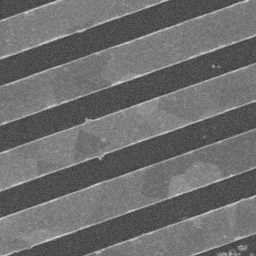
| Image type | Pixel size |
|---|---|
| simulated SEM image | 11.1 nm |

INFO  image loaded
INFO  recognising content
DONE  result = one or a few lines or trenches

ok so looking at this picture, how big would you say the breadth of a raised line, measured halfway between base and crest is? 403 nm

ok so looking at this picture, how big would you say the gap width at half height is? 291 nm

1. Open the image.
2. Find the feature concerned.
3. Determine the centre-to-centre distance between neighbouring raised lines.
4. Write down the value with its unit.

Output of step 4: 693 nanometers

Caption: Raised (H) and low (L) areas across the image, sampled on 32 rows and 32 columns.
LLLLLLHHHHHHHHHHHHHHLLLLLLLLLHHH
LLLHHHHHHHHHHHHHHLLLLLLLLLLHHHHH
HHHHHHHHHHHHHHLLLLLLLLLLHHHHHHHH
HHHHHHHHHHHLLLLLLLLLLHHHHHHHHHHH
HHHHHHHHLLLLLLLLLLHHHHHHHHHHHHHH
HHHHHLLLLLLLLLLHHHHHHHHHHHHHHLLL
HHHLLLLLLLLLHHHHHHHHHHHHHHLLLLLL
LLLLLLLLLLHHHHHHHHHHHHHLLLLLLLLL
LLLLLLLHHHHHHHHHHHHHLLLLLLLLLLHH
LLLLHHHHHHHHHHHHHHLLLLLLLLLHHHHH
LHHHHHHHHHHHHHHLLLLLLLLLLHHHHHHH
HHHHHHHHHHHHLLLLLLLLLLHHHHHHHHHH
HHHHHHHHHLLLLLLLLLLHHHHHHHHHHHHH
HHHHHHLLLLLLLLLLHHHHHHHHHHHHHLLL
HHHLLLLLLLLLLHHHHHHHHHHHHHHLLLLL
LLLLLLLLLLHHHHHHHHHHHHHHLLLLLLLL
LLLLLLLLHHHHHHHHHHHHHLLLLLLLLLLH
LLLLLHHHHHHHHHHHHHLLLLLLLLLLHHHH
LLHHHHHHHHHHHHHLLLLLLLLLLHHHHHHH
HHHHHHHHHHHHHLLLLLLLLLHHHHHHHHHH
HHHHHHHHHHLLLLLLLLLHHHHHHHHHHHHH
HHHHHHHLLLLLLLLLLHHHHHHHHHHHHHLL
HHHHLLLLLLLLLLHHHHHHHHHHHHHHLLLL
HLLLLLLLLLLHHHHHHHHHHHHHHLLLLLLL
LLLLLLLLHHHHHHHHHHHHHHLLLLLLLLLL
LLLLLHHHHHHHHHHHHHHLLLLLLLLLLHHH
LLHHHHHHHHHHHHHHLLLLLLLLLLHHHHHH
HHHHHHHHHHHHHLLLLLLLLLLHHHHHHHHH
HHHHHHHHHHHLLLLLLLLLHHHHHHHHHHHH
HHHHHHHHLLLLLLLLLLHHHHHHHHHHHHHL
HHHHHLLLLLLLLLLHHHHHHHHHHHHHLLLL
HHLLLLLLLLLLHHHHHHHHHHHHHLLLLLLL